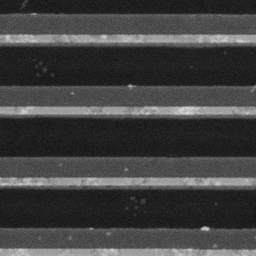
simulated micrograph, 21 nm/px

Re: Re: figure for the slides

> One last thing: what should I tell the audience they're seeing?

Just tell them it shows lines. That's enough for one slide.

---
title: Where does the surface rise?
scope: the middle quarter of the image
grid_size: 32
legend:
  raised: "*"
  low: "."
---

................................
................................
................................
................................
................................
................*...............
********************************
********************************
********************************
********************************
********************************
********************************
............***..***************
................................
................................
................................
................................
................................
................................
................................
................................
................................
................................
*********************.***.....**
********************************
********************************
********************************
********************************
********************************
********************************
................................
................................